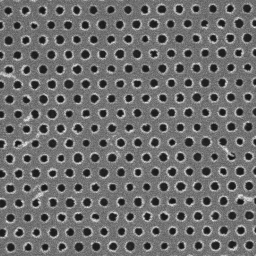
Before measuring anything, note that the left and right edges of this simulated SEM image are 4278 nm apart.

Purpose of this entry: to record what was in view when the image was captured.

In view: a regular array of holes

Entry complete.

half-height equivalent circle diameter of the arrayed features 135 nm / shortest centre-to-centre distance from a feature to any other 280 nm